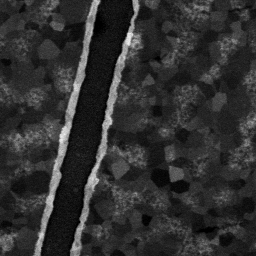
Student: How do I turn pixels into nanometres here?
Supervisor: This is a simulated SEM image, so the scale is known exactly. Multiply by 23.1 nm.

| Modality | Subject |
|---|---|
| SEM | one or a few lines or trenches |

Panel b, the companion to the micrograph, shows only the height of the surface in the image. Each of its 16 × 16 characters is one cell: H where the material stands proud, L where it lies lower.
HHHHHHLLLHHHHHHH
HHHHHHLLHHHHHHHH
HHHHHLLLHHHHHHHH
HHHHHLLLHHHHHHHH
HHHHHLLHHHHHHHHH
HHHHHLLHHHHHHHHH
HHHHLLLHHHHHHHHH
HHHHLLLHHHHHHHHH
HHHHLLLHHHHHHHHH
HHHHLLHHHHHHHHHH
HHHHLLHHHHHHHHHH
HHHLLLHHHHHHHHHH
HHHLLHHHHHHHHHHH
HHHLLHHHHHHHHHHH
HHHLLHHHHHHHHHHH
HHLLLHHHHHHHHHHH